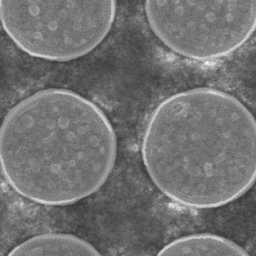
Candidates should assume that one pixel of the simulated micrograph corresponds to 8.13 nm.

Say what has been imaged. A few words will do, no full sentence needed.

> raised bodies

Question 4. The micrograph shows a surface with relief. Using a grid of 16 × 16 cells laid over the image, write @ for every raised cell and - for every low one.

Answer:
@@@@@@@--@@@@@@@
@@@@@@@--@@@@@@@
-@@@@@----@@@@@-
--@@@-------@@--
----------------
----------------
-@@@@@----@@@@@-
@@@@@@@--@@@@@@@
@@@@@@@--@@@@@@@
@@@@@@@--@@@@@@@
@@@@@@@--@@@@@@@
-@@@@@----@@@@@@
--@@@------@@@--
----------------
----------------
-@@@@@----@@@@@-